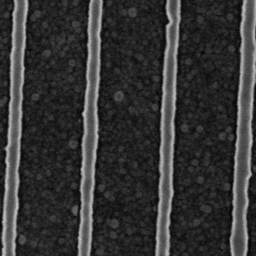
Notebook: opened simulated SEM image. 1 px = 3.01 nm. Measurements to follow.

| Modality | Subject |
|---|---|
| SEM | one or a few lines or trenches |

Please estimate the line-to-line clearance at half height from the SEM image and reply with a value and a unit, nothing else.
193 nm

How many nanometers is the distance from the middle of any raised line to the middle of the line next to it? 230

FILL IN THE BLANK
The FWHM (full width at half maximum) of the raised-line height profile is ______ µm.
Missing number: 0.0372